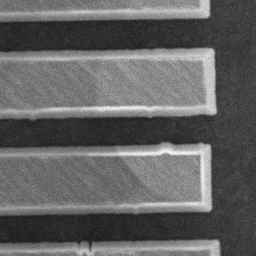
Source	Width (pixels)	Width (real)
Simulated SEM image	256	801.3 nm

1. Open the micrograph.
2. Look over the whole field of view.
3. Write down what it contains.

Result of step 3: one or a few lines or trenches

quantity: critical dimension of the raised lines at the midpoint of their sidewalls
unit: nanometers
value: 186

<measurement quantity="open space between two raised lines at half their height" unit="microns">0.115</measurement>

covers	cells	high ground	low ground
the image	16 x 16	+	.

+++++++++++++...
................
................
..+++++++++++...
+++++++++++++...
+++++++++++++...
+++++++++++++...
................
................
.++++++++++++...
+++++++++++++...
+++++++++++++...
+++++++++++++...
................
................
.++++++++++++...